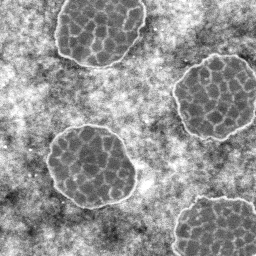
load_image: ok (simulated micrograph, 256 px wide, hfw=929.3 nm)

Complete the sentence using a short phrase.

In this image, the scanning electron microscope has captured raised bodies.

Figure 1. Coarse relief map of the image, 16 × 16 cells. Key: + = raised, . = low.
....+++++.......
....+++++.......
...+++++........
....++++.....++.
............++++
...........+++++
...........+++++
...........+++++
....+++.....++..
...+++++........
...+++++........
...+++++........
....++++....+++.
...........+++++
...........+++++
...........+++++